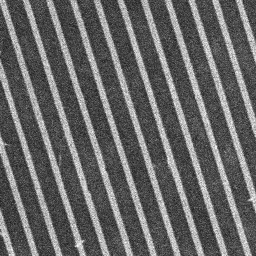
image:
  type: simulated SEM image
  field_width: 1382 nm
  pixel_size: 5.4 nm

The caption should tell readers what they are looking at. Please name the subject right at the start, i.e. parallel lines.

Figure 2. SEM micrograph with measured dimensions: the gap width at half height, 96.6 nm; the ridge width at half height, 0.0277 um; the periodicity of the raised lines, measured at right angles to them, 0.122 micrometres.